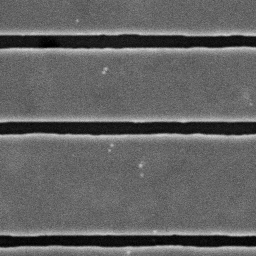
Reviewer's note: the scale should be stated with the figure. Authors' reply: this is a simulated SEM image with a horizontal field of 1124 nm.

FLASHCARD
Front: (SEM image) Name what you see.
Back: lines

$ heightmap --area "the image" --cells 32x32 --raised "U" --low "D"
UUUUUUUUUUUUUUUUUUUUUUUUUUUUUUUU
UUUUUUUUUUUUUUUUUUUUUUUUUUUUUUUU
UUUUUUUUUUUUUUUUUUUUUUUUUUUUUUUU
UUUUUUUUUUUUUUUUUUUUUUUUUUUUUUUU
DDDDDDDDDDDDDDDDDDDDDDDDDDDDDDDD
DDDDDDDDDDDDDDDDDDDDDDDDDDDDDDDD
UUUUUUUUUUUUUUUUUUUUUUUUUUUUUUUU
UUUUUUUUUUUUUUUUUUUUUUUUUUUUUUUU
UUUUUUUUUUUUUUUUUUUUUUUUUUUUUUUU
UUUUUUUUUUUUUUUUUUUUUUUUUUUUUUUU
UUUUUUUUUUUUUUUUUUUUUUUUUUUUUUUU
UUUUUUUUUUUUUUUUUUUUUUUUUUUUUUUU
UUUUUUUUUUUUUUUUUUUUUUUUUUUUUUUU
UUUUUUUUUUUUUUUUUUUUUUUUUUUUUUUU
UUUUUUUUUUUUUUUUUUUUUUUUUUUUUUUU
DDDDDDDDDDDDDDDDDDDDDDDDDDDDDDDD
DDDDDDDDDDDDDDDDDDDDDDDDDDDDDDDD
UUUUUUUUUUUUUUUUUUUUUUUUUUUUUUUU
UUUUUUUUUUUUUUUUUUUUUUUUUUUUUUUU
UUUUUUUUUUUUUUUUUUUUUUUUUUUUUUUU
UUUUUUUUUUUUUUUUUUUUUUUUUUUUUUUU
UUUUUUUUUUUUUUUUUUUUUUUUUUUUUUUU
UUUUUUUUUUUUUUUUUUUUUUUUUUUUUUUU
UUUUUUUUUUUUUUUUUUUUUUUUUUUUUUUU
UUUUUUUUUUUUUUUUUUUUUUUUUUUUUUUU
UUUUUUUUUUUUUUUUUUUUUUUUUUUUUUUU
UUUUUUUUUUUUUUUUUUUUUUUUUUUUUUUU
UUUUUUUUUUUUUUUUUUUUUUUUUUUUUUUU
UUUUUUUUUUUUUUUUUUUUUUUUUUUUUUUU
DDDDDDDDDDDDDDDDDDDDDDDDDDDDDDDD
DDDDDDDDDDDDDDDDDDDDDDDDDDDDDDDD
UUUUUUUUUUUUUUUUUUUUUUUUUUUUUUUU